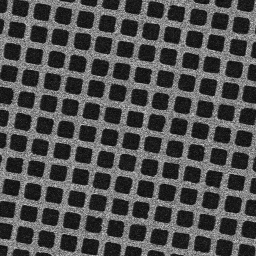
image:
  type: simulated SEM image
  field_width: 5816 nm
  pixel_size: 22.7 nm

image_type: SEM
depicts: a regular array of holes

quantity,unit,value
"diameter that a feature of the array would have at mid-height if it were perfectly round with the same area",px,18.1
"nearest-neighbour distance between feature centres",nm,494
